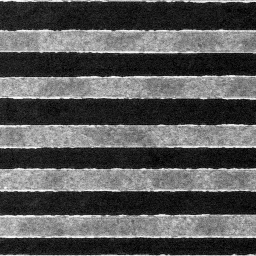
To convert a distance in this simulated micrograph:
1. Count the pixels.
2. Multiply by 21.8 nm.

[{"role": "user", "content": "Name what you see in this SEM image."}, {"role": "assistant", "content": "lines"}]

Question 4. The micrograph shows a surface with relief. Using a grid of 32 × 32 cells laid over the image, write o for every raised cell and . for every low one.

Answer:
................................
................................
................................
................................
oooooooooooooooooooooooooooooooo
oooooooooooooooooooooooooooooooo
..o.......oooooooooooooooooooooo
................................
................................
................................
oooooooooooooooooooooooooooooooo
oooooooooooooooooooooooooooooooo
................................
................................
................................
................................
oooooooooooooooooooooooooooooooo
oooooooooooooooooooooooooooooooo
................................
................................
................................
oooooooooooooooooooooooooooooooo
oooooooooooooooooooooooooooooooo
oooooooooooooooooooooooooooooooo
................................
................................
................................
oooooooooooooooooooooooooooooooo
oooooooooooooooooooooooooooooooo
oooooooooooooooooooooooooooooooo
................................
................................